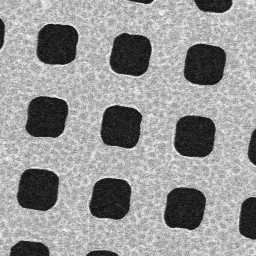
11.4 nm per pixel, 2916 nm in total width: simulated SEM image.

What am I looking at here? a regular array of holes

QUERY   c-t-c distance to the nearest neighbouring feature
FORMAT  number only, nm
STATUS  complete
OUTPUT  827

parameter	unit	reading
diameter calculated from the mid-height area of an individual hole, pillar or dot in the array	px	43.5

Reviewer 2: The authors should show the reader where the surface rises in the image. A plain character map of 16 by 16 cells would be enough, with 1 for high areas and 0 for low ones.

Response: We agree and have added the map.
1111111111110011
1110111111111111
1100011001111111
1100011001110011
1111111001110011
1111111111111111
1100111111111111
1100110001100111
1100110001100111
1111111111100111
1111111111111111
1000110011111111
1000110011000110
1111110011000110
1111111111111110
1001111111111111